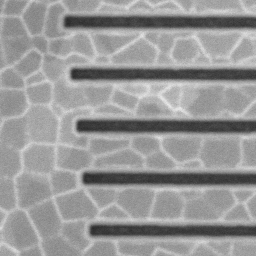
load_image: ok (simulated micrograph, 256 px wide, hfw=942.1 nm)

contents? parallel lines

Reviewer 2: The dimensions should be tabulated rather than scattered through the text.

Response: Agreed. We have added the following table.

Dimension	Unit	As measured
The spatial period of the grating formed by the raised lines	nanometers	192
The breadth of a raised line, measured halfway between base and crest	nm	135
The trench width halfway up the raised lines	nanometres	55.6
